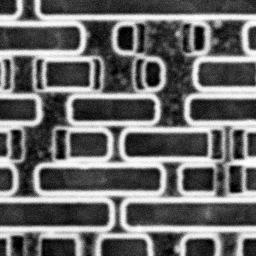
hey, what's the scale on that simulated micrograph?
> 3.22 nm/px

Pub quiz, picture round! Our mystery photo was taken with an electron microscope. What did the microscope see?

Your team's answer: parallel lines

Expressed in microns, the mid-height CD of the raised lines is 0.0253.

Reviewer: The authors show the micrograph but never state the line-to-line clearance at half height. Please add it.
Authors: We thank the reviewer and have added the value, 0.0881 micrometres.